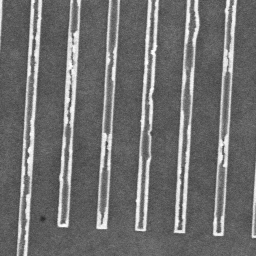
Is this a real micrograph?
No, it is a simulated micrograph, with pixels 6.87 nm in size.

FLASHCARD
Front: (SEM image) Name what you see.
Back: parallel lines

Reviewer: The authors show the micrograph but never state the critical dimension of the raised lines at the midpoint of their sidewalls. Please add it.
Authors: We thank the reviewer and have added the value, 60.8 nm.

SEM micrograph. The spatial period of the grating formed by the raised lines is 268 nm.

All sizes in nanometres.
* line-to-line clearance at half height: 201